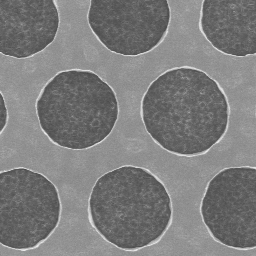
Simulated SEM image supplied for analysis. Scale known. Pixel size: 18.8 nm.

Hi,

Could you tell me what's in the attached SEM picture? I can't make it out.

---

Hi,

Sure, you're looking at holes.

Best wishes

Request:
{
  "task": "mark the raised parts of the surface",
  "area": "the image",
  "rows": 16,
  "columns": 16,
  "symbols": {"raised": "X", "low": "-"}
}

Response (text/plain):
----XX-----XX---
----XX-----XX---
---XXX----XXX---
X-XXXXXXXXXXXXXX
XXXX--XXXX---XXX
XXX----XX-----XX
XX-----XX-----XX
XX-----XX-----XX
XXX----XX-----XX
XXXXXXXXXXX--XXX
XXXXXXXX-XXXXXX-
---XXX----XXX---
----XX-----XX---
----XX-----XX---
---XXX----XXX---
XXXXXXXX-XXXXXXX